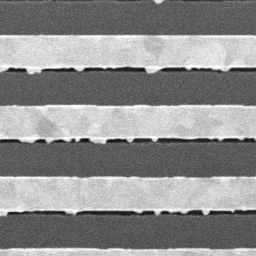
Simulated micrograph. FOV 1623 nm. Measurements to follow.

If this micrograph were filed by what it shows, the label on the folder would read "lines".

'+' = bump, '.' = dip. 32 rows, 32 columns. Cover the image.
................................
................................
................................
................................
................................
++++++++++++++++++++++++++++++++
++++++++++++++++++++++++++++++++
++++++++++++++++++++++++++++++++
.....+..........................
................................
................................
................................
................................
++++++++++++++++++++++++++++++++
++++++++++++++++++++++++++++++++
++++++++++++++++++++++++++++++++
++++++++++++++++++++++++++++++++
................................
................................
................................
................................
................................
++++++++++++++++++++++++++++++++
++++++++++++++++++++++++++++++++
++++++++++++++++++++++++++++++++
++++++++++++++++++++++++++++++++
................................
................................
................................
................................
................................
++++++++++++++++++++++++++++++++